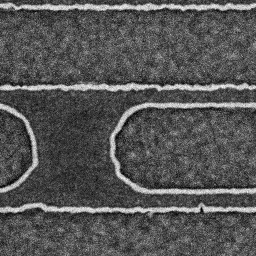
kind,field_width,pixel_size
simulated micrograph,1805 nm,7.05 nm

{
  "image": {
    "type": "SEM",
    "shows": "one or a few lines or trenches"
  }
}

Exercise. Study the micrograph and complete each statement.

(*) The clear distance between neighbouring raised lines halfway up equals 572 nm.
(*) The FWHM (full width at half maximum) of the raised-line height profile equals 128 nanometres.